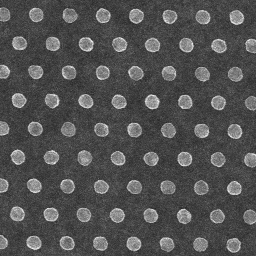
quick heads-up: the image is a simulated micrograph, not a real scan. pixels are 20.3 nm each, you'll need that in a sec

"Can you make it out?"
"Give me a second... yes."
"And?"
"a regular array of raised bodies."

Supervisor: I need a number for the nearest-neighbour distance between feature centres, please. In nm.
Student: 666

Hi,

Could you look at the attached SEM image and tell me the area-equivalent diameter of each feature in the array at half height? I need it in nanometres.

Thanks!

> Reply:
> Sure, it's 286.